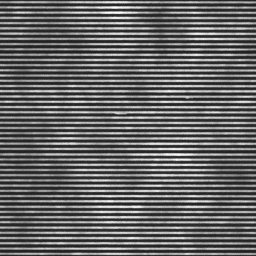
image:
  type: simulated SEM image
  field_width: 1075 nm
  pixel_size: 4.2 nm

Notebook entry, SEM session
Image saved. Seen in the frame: parallel lines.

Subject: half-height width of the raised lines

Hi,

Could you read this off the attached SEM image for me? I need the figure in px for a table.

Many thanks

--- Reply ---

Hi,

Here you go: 1.74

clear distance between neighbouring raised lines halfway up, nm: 11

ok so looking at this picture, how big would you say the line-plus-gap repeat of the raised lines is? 22 nanometers